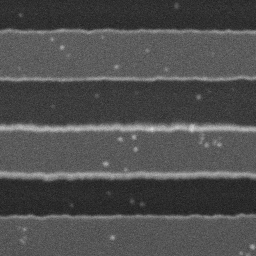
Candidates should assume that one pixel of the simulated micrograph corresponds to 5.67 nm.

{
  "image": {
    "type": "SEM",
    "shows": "lines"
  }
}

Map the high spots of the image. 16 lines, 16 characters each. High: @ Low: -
----------------
----------------
@@@@@@@@@@@@@@@@
@@@@@@@@@@@@@@@@
@@@@@@@@@@@@@@@@
----------------
----------------
----------------
@@@@@@@@@@@@@@@@
@@@@@@@@@@@@@@@@
@@@@@@@@@@@@@@@@
----------------
----------------
---@---@@@--@--@
@@@@@@@@@@@@@@@@
@@@@@@@@@@@@@@@@